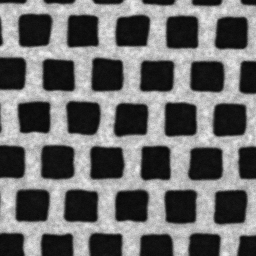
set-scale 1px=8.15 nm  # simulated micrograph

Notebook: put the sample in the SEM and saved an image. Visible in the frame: a regular array of holes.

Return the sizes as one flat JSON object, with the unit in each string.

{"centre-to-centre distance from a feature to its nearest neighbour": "398 nanometers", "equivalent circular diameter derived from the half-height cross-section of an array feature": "293 nm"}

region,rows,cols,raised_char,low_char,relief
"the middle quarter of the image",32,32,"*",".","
...****........****.........****
...****........****........*****
...****........****.........****
...****........****.........****
...****........****........*****
...****........****........*****
...****.......*****........*****
********************************
********************************
*......*************************
.........****........****.......
*........****........****.......
*........****........****.......
*........****........****.......
*........***.........****.......
*........***.........****.......
*.......****.........****.......
****....*****.......*****.......
********************************
********************************
..******.***********....********
...***.........****........*****
...***.........****........****.
...****........****........****.
...****........****........****.
...****........****........****.
...***.........****........****.
...***.........****........****.
..*****.......*****........****.
********************************
********************************
*....***********....******.**...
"